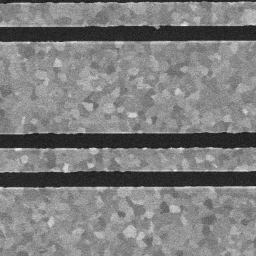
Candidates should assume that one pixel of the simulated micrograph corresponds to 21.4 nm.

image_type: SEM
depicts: lines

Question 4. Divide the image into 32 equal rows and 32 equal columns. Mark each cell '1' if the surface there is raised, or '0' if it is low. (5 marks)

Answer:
11111111111111111111111111111111
11111111111111111111111111111111
11111111111111111111111111111111
00000000000000000000000000000000
00000000000000000000000000000000
11111111111111111111111111111111
11111111111111111111111111111111
11111111111111111111111111111111
11111111111111111111111111111111
11111111111111111111111111111111
11111111111111111111111111111111
11111111111111111111111111111111
11111111111111111111111111111111
11111111111111111111111111111111
11111111111111111111111111111111
11111111111111111111111111111111
11111111111111111111111111111111
00000000000000000000000000000000
00000000000000000000000000000000
11111111111111111111111111111111
11111111111111111111111111111111
00000000000000000000000000000000
00000000000000000000000000000000
00000000111110111111111111111111
11111111111111111111111111111111
11111111111111111111111111111111
11111111111111111111111111111111
11111111111111111111111111111111
11111111111111111111111111111111
11111111111111111111111111111111
11111111111111111111111111111111
11111111111111111111111111111111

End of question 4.